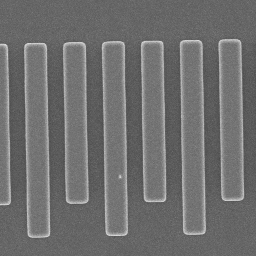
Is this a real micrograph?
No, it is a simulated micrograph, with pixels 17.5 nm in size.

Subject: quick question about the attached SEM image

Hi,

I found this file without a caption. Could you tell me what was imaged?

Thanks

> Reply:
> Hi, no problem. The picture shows groups of lines, slits or small figures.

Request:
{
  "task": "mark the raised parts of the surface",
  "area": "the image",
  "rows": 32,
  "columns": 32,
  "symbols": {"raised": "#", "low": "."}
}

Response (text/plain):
................................
................................
................................
................................
................................
....#...##...##...##...##..###..
#..###..###..###..##...##..###..
#..###..###..###..##...##..###..
#..###..###..###..##...##..###..
#..###..###..###..##...##..###..
#..###..###..###..##...##..###..
#..###..###..###..##...##..###..
#..###..###..###..###..##...##..
#..###..###..###..###..##...##..
#..###..###..###..###..##...##..
#..###..###..###..###..##...##..
#..###..###..###..###..##...##..
#..###..###..###..###..##...##..
#..###..###..###..###..##...##..
#..###..###..###..###..##...##..
#..###..###..###..###..##...##..
#..###..###..###..###..##...##..
#..###..###..###..###..##...##..
#..###..###..###..###..###..##..
#..###..###..###..###..###..##..
#..###.......###.......###......
...###.......###.......###......
...###.......###.......###......
...###.......###.......###......
....##..........................
................................
................................